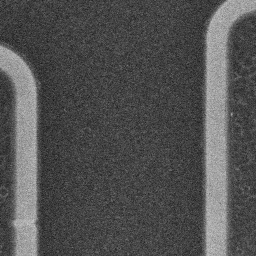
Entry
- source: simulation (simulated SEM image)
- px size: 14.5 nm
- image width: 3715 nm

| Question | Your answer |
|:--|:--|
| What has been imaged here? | one or a few lines or trenches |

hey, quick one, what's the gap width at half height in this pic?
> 2730 nanometres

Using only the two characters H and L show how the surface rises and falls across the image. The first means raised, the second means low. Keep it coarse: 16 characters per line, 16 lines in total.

LLLLLLLLLLLLLLLH
LLLLLLLLLLLLLLHH
LLLLLLLLLLLLLLHH
LLLLLLLLLLLLLLHH
HLLLLLLLLLLLLHHH
HHLLLLLLLLLLLHHH
HHLLLLLLLLLLLHHH
HHLLLLLLLLLLLHHH
HHLLLLLLLLLLLHHH
HHLLLLLLLLLLLHHH
HHLLLLLLLLLLLHHH
HHLLLLLLLLLLLLHH
HHLLLLLLLLLLLLHH
HHLLLLLLLLLLLHHH
HHLLLLLLLLLLLHHH
HHLLLLLLLLLLLHHH